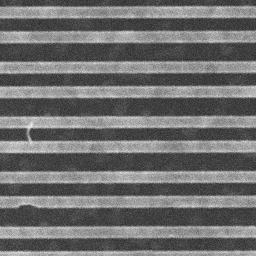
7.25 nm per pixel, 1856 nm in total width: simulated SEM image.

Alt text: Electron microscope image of parallel lines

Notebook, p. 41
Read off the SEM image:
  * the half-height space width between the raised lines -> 108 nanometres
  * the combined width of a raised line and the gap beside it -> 199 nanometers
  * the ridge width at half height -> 73.4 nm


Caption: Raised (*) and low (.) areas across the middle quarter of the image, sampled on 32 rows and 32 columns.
********************************
********************************
................................
................................
................................
................................
********************************
********************************
................................
................................
................................
................................
................................
********************************
********************************
********************************
................................
................................
................................
........*.*.*****.******..***.**
********************************
********************************
................................
................................
................................
................................
................................
********************************
********************************
*******.........................
................................
................................